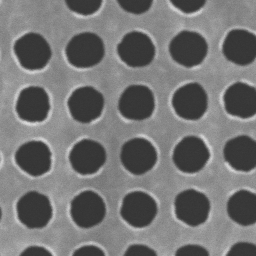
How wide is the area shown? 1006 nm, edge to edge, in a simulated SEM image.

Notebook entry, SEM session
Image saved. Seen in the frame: a regular array of holes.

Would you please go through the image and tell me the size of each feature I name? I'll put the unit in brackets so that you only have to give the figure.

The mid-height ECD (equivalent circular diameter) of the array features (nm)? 145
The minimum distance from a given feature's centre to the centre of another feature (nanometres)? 204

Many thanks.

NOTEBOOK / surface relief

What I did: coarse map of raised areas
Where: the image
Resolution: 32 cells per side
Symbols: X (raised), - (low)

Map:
XXXXXXXX-----XX----XX-----XXXXXX
XXXXXXXXX---XXXX--XXXXX-XXXXXXXX
XXXXXXXXXXXXXXXXXXXXXXXXXXXXXXXX
XXXXXXXXXXXXXXXXXXXXXXXXXXXXXXXX
XXX--XXXX---XXXX---XXX---XXX----
XX----XX-----XX----XX-----XX----
XX----XX-----XX----XX-----XX----
XX----XXX----XX----XXX---XXXX---
XXX--XXXXX-XXXXXXXXXXXXXXXXXXXXX
XXXXXXXXXXXXXXXXXXXXXXXXXXXXXXXX
XXXXXXXXXXXXXXXXXXXXXXX--XXXX--X
XXX---XXX---XXX----XXX----XX----
XX----XX-----XX----XX-----XX----
XX----XXX----XX----XXX----XX----
XX----XXX---XXX----XXX---XXXX---
XXXXXXXXXXXXXXXXXXXXXXXXXXXXXXXX
XXXXXXXXXXXXXXXXXXXXXXXXXXXXXXXX
XXXXXXXXXX-XXXXX--XXXXX--XXXX---
XX----XXX----XX----XXX----XX----
XX----XXX----XX-----XX----XX----
XX----XXX----XX----XXX----XXX---
XXX---XXXX--XXXX--XXXXX--XXXXXXX
XXXXXXXXXXXXXXXXXXXXXXXXXXXXXXXX
XXXXXXXXXXXXXXXXXXXXXXXXXXXXXXXX
XXX---XXXX---XXX---XXX----XXX---
XX----XXX----XX-----XX----XX----
XX-----XX----XX-----XX----XX----
XX----XXX----XXX---XXX----XXX---
XXXX-XXXXX-XXXXXX-XXXXXXXXXXXXXX
XXXXXXXXXXXXXXXXXXXXXXXXXXXXXXXX
XXXXXXXXXXXXXXXXXXXXXXXXXXXXX---
XXX---XXX----XXX---XXX----XX----